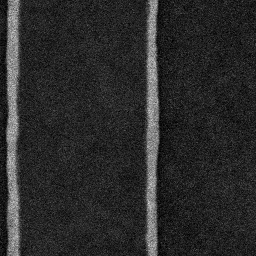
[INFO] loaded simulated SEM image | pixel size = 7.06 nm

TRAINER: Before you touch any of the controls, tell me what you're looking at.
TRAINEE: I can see one or a few lines or trenches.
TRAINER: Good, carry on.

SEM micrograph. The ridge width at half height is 977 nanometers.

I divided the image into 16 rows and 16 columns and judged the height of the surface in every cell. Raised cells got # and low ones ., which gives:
.#########......
.#########......
.########.......
.########.......
.########.......
.########.......
.########.......
.#########......
.#########......
.########.......
.########.......
.########.......
.########.......
.########.......
.########.......
.#########......